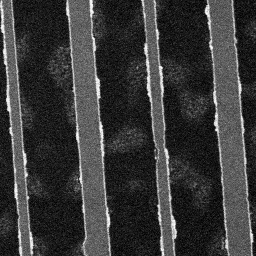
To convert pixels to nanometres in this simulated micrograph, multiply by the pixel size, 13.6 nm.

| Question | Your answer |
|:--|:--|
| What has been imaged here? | one or a few lines or trenches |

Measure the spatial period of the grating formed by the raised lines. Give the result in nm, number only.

958